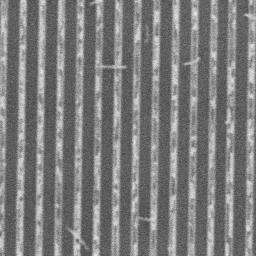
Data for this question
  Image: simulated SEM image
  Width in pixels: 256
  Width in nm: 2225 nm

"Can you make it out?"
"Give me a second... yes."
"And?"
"parallel lines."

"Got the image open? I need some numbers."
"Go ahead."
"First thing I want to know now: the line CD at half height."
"0.0489 microns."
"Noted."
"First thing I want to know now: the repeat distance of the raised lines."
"19.1 px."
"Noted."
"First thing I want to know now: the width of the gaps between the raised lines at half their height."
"13.1 pixels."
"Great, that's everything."